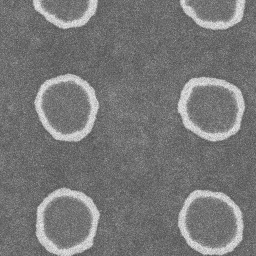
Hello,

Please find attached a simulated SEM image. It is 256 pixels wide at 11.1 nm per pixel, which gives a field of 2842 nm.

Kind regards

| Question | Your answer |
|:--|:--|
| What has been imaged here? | raised bodies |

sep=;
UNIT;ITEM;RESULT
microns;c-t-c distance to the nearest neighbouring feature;1.27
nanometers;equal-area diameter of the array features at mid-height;660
